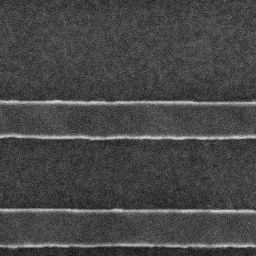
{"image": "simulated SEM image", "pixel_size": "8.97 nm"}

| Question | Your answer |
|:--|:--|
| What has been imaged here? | lines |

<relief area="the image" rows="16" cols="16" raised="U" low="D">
DDDDDDDDDDDDDDDD
DDDDDDDDDDDDDDDD
DDDDDDDDDDDDDDDD
DDDDDDDDDDDDDDDD
DDDDDDDDDDDDDDDD
DDDDDDDDDDDDDDDD
UUUUUUUUUUUUUUUU
UUUUUUUUUUUUUUUU
UUUUUUUUUUUUUUUU
DDDDDDDDDDDDDDDD
DDDDDDDDDDDDDDDD
DDDDDDDDDDDDDDDD
DDDDDDDDDDDDDDDD
UUUUUUUUUUUUUUUU
UUUUUUUUUUUUUUUU
DDDDDDDDDDDDDDDD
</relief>